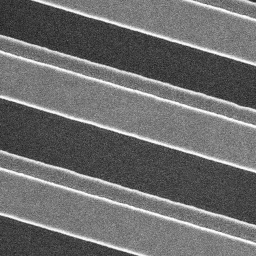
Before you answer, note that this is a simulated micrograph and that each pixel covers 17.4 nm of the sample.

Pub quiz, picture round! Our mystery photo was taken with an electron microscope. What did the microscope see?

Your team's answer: lines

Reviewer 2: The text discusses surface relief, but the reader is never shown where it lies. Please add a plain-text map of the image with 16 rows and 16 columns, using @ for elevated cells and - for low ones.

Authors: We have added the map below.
----@@@@@@@@@@@@
-------@@@@@@@@@
@----------@@@@@
@@@@----------@@
@@@@@@@@--------
@@@@@@@@@@@-----
--@@@@@@@@@@@@@-
-----@@@@@@@@@@@
--------@@@@@@@@
------------@@@@
@@@@-----------@
@@@@@@@---------
@@@@@@@@@@------
@@@@@@@@@@@@@@--
----@@@@@@@@@@@@
-------@@@@@@@@@